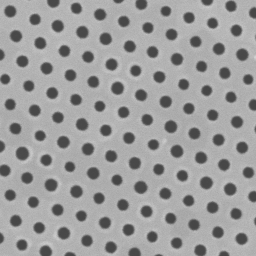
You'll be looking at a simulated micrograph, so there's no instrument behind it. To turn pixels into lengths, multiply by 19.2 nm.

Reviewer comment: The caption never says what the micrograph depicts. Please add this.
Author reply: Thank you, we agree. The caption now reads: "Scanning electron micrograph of a regular array of holes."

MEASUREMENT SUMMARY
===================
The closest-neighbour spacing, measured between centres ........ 468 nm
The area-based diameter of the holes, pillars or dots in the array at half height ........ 229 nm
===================